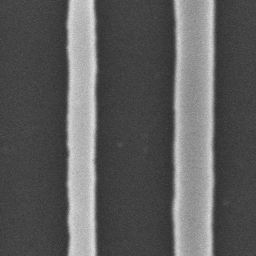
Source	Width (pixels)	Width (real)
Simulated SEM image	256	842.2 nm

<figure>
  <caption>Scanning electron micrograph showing lines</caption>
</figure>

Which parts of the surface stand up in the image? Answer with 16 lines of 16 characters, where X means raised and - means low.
----XX-----XX---
----XX-----XX---
----XX-----XX---
----XX-----XX---
----XX-----XX---
----XX-----XX---
----XX-----XX---
----XX-----XX---
----XX-----XX---
----XX-----XX---
----XX-----XX---
----XX-----XX---
----XX-----XX---
----XX-----XX---
----XX-----XX---
----XX-----XX---